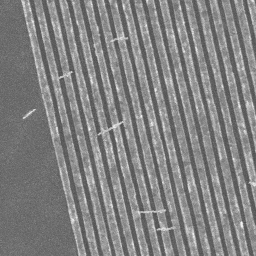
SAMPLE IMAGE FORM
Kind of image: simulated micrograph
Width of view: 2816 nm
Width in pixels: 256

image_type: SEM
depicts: parallel lines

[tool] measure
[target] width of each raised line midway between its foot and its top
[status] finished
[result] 76.4 nanometres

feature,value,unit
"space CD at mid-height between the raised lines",5.13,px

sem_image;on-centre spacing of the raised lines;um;0.135